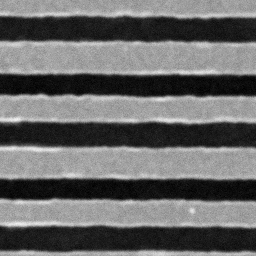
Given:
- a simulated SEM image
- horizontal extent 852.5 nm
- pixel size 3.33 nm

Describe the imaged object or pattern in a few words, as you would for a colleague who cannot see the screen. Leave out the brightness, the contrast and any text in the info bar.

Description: lines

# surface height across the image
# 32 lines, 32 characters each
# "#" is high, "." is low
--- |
################################
################################
................................
................................
................................
################################
################################
################################
################################
................................
................................
................................
################################
################################
################################
................................
................................
................................
######.#.#######......#..#....#.
################################
################################
################################
................................
................................
................................
################################
################################
################################
................................
................................
................................
..###............####..#........